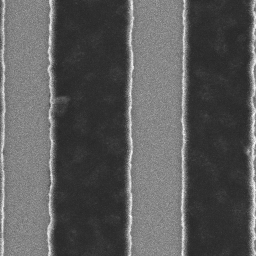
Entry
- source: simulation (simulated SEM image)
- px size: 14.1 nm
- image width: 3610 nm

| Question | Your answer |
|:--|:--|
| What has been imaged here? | one or a few lines or trenches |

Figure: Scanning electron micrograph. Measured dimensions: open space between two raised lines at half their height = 0.69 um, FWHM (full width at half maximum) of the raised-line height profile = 1130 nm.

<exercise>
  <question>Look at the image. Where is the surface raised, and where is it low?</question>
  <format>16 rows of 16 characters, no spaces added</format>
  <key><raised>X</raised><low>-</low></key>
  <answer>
---XXXXX---XXXXX
---XXXXX---XXXXX
---XXXXX---XXXXX
---XXXXX---XXXXX
---XXXXX---XXXXX
---XXXXX---XXXXX
---XXXXX---XXXXX
---XXXXX---XXXXX
---XXXXX---XXXXX
---XXXXX---XXXXX
---XXXXX---XXXXX
---XXXXX---XXXXX
---XXXXX---XXXXX
---XXXXX---XXXXX
---XXXXX---XXXXX
---XXXXX---XXXXX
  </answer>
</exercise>